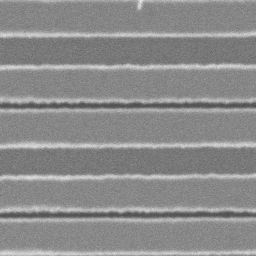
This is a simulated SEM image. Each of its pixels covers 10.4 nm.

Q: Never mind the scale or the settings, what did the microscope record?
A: lines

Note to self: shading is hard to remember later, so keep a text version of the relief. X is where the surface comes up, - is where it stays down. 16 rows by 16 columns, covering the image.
XXXXXXXXXXXXXXXX
XXXXXXXXXXXXXXXX
----------------
----------------
XXXXXXXXXXXXXXXX
XXXXXXXXXXXXXXXX
XXXXXXXXXXXXXXXX
XXXXXXXXXXXXXXXX
XXXXXXXXXXXXXXXX
----------------
----------------
XXXXXXXXXXXXXXXX
XXXXXXXXXXXXXXXX
XXXXXXXXXXXXXXXX
XXXXXXXXXXXXXXXX
XXXXXXXXXXXXXXXX